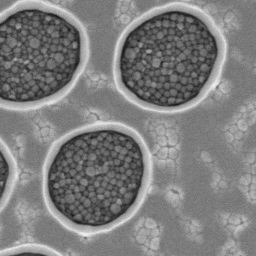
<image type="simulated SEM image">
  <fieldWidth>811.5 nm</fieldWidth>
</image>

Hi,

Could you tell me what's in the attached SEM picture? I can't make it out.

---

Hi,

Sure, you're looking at holes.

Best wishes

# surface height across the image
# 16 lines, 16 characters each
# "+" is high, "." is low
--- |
+..+++++++++++++
.....++++....+++
.....+++......++
.....++.......++
.....++......+++
....++++.....+++
+.+++++++...++++
++++++++++++++++
++++....++++++++
+++......+++++++
.++......+++++++
.++......+++++++
+++......+++++++
++++....++++++++
++++++++++++++++
++++++++++++++++